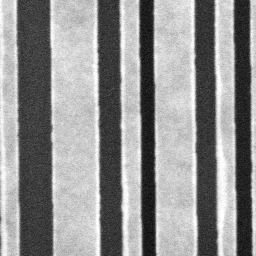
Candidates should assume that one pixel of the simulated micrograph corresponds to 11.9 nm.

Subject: lines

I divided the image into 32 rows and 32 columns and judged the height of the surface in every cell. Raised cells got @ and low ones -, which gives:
@@----@@@@@@---@@--@@@@@---@@--@
@@----@@@@@@---@@--@@@@@---@@--@
@@----@@@@@@---@@--@@@@@---@@--@
@@----@@@@@@---@@--@@@@@---@@--@
@@----@@@@@@---@@--@@@@@---@@--@
@@----@@@@@@---@@--@@@@@---@@--@
@@-----@@@@@---@@--@@@@@---@@--@
@@-----@@@@@---@@--@@@@@---@@--@
@@-----@@@@@---@@--@@@@@---@@--@
@@-----@@@@@---@@--@@@@@---@@--@
@@-----@@@@@---@@--@@@@@---@@--@
@@-----@@@@@---@@--@@@@@---@@--@
@@-----@@@@@---@@--@@@@@---@@--@
@@-----@@@@@---@@--@@@@@---@@--@
@@-----@@@@@---@@@-@@@@@---@@--@
@@-----@@@@@---@@@-@@@@@---@@--@
@@-----@@@@@---@@@-@@@@@---@@--@
@@-----@@@@@---@@@-@@@@@---@@--@
@@-----@@@@@---@@@-@@@@@---@@--@
@@-----@@@@@---@@@-@@@@@---@@--@
@@-----@@@@@---@@@-@@@@@---@@--@
@@-----@@@@@---@@@-@@@@@---@@--@
@@-----@@@@@---@@@-@@@@@---@@--@
@@-----@@@@@---@@@--@@@@---@@--@
@@-----@@@@@---@@@--@@@@---@@--@
@@-----@@@@@---@@@--@@@@---@@---
@@-----@@@@@---@@@--@@@@---@@---
@@-----@@@@@---@@@--@@@@@--@@---
@@-----@@@@@---@@@--@@@@@--@@---
@@-----@@@@@---@@@--@@@@@--@@---
@@-----@@@@@---@@@--@@@@@--@@---
@@-----@@@@@---@@@--@@@@@--@@---